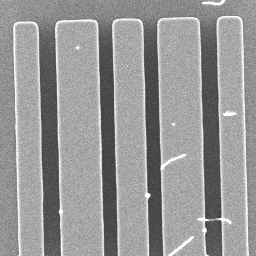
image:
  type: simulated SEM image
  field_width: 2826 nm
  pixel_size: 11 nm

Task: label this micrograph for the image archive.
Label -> groups of lines, slits or small figures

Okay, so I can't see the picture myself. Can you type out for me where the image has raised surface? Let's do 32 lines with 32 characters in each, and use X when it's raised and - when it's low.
--------------------------------
--------------------------------
---------XXX--XXX---XXXXX--XXX--
--XXX--XXXXX--XXXX--XXXXX--XXX--
--XXX--XXXXX--XXXX--XXXXX--XXX--
--XXX--XXXXX--XXXX--XXXXX--XXX--
--XXX--XXXXX--XXXX--XXXXX--XXX--
--XXX--XXXXX--XXXX--XXXXX--XXX--
--XXX--XXXXX--XXXX--XXXXX--XXX--
--XXX--XXXXX--XXXX--XXXXX--XXX--
--XXX--XXXXX--XXXX--XXXXX--XXX--
--XXX--XXXXX--XXXX--XXXXX--XXX--
--XXX--XXXXXX-XXXX--XXXXX--XXX--
--XXX--XXXXXX-XXXX--XXXXX--XXXX-
--XXX--XXXXXX-XXXX--XXXXX--XXXX-
--XXX--XXXXXX-XXXX--XXXXX--XXXX-
--XXX--XXXXXX-XXXX--XXXXX---XXX-
--XXX--XXXXXX-XXXX--XXXXX---XXX-
--XXX--XXXXXX-XXXX--XXXXX---XXX-
--XXX--XXXXXX-XXXX--XXXXX---XXX-
--XXX--XXXXXX--XXX--XXXXX---XXX-
--XXX--XXXXXX--XXX--XXXXX---XXX-
--XXX--XXXXXX--XXX--XXXXX---XXX-
--XXX--XXXXXX--XXX--XXXXX---XXX-
--XXX---XXXXX--XXXX-XXXXX---XXX-
--XXX---XXXXX--XXX--XXXXX---XXX-
--XXX--XXXXXX--XXX--XXXXX---XXX-
--XXX---XXXXX--XXX--XXXXXX--XXX-
--XXX---XXXXX--XXX--XXXXXX--XXX-
--XXX---XXXXX--XXXX-XXXXXX--XXX-
--XXX---XXXXX--XXXX-XXXXXX--XXX-
--XXX---XXXXX--XXXX--XXXXX--XXX-